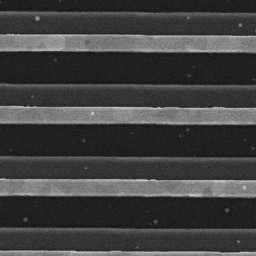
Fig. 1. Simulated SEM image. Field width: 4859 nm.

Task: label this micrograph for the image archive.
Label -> lines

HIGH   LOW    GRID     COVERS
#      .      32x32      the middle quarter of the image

................................
................................
................................
................................
................................
##############################..
################################
################################
################################
################################
################################
################################
################################
################################
################################
................................
................................
................................
................................
................................
................................
................................
................................
###########################.....
################################
################################
################################
################################
################################
################################
################################
################################